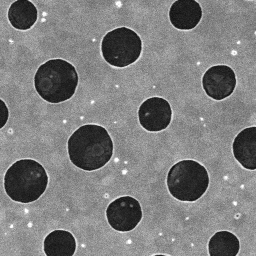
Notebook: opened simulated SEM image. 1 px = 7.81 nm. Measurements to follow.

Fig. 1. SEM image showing a regular array of holes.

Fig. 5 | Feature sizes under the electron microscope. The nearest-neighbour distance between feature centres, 564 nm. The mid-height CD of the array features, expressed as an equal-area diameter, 322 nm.